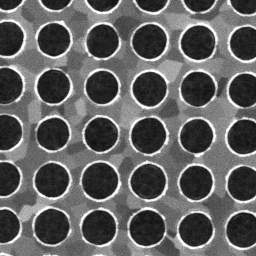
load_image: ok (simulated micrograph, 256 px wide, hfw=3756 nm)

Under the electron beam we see a regular array of holes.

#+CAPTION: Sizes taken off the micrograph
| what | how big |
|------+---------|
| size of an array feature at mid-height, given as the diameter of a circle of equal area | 34.1 pixels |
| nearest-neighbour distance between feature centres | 680 nm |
